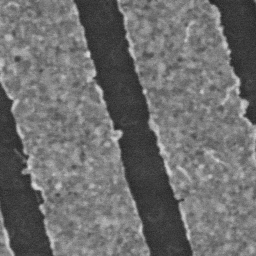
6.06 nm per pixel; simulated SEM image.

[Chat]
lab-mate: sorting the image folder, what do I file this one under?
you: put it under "one or a few lines or trenches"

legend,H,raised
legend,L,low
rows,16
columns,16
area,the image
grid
HHHHHLLHHHHHHLLL
HHHHHLLLHHHHHHLL
HHHHHLLLHHHHHHLL
HHHHHHLLHHHHHHLL
HHHHHHLLLHHHHHHL
HHHHHHLLLHHHHHHL
LHHHHHHLLHHHHHHL
LHHHHHHLLHHHHHHL
LHHHHHHLLLHHHHHH
LLHHHHHLLLHHHHHH
LLHHHHHHLLHHHHHH
LLHHHHHHLLLHHHHH
LLLHHHHHLLLHHHHH
LLLHHHHHHLLHHHHH
LLLHHHHHHLLLHHHH
HLLHHHHHHLLLHHHH